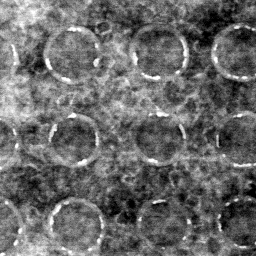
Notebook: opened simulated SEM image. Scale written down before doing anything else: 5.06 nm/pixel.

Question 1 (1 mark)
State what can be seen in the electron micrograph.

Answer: raised bodies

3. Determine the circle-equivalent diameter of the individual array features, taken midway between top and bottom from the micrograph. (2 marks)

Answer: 55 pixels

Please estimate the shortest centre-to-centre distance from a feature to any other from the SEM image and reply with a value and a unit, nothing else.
0.434 µm